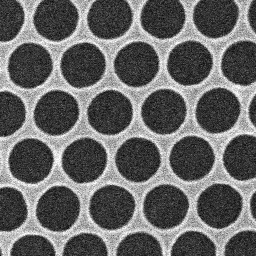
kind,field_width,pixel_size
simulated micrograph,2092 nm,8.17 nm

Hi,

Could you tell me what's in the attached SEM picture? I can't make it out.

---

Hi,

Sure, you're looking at a regular array of holes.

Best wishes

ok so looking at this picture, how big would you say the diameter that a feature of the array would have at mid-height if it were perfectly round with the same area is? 0.372 microns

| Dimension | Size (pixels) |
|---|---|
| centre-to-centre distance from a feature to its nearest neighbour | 53.6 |